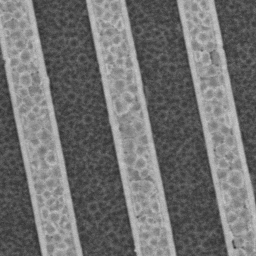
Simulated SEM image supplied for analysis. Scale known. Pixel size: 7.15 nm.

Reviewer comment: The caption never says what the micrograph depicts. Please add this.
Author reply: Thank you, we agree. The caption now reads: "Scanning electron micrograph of one or a few lines or trenches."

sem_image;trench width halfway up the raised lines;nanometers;402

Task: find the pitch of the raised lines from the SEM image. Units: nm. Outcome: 645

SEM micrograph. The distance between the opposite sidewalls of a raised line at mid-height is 0.245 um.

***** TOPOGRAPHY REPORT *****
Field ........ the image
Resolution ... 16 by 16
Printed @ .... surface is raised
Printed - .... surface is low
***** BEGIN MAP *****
@@----@@---@@---
@@----@@---@@@--
@@----@@----@@--
@@----@@----@@--
-@@---@@@---@@--
-@@----@@---@@--
-@@----@@----@--
-@@----@@----@@-
-@@@---@@----@@-
--@@---@@@---@@-
--@@----@@---@@-
--@@----@@----@@
--@@----@@----@@
--@@----@@----@@
--@@@---@@@---@@
---@@----@@---@@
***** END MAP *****